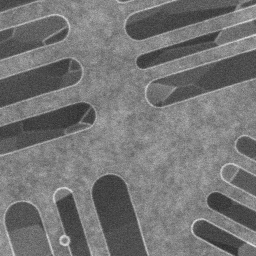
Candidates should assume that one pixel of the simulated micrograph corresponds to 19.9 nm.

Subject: groups of lines, slits or small figures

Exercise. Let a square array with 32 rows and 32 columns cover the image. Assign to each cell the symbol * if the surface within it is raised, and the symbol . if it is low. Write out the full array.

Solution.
****................************
.................************...
....****........**********.....*
.********.......*******.....****
********........****.....******.
*******...............******....
***................******.....**
.......**........*****.....*****
....******.......**.....********
.*********...........***********
*********..........***********..
*******...........********......
***...............*****.........
.......*****....................
....********....................
.***********....................
**********......................
*******.......................**
***..........................***
...............................*
................................
............................***.
............***.............****
...........*****..............**
.......**..*****..........**....
..**...***..*****.........****..
.****..***..*****..........*****
.****...**..*****........*...***
.*****..**...*****......****...*
.*****..***..*****......*****...
.*****..***..*****........*****.
..*****..**...****..........****